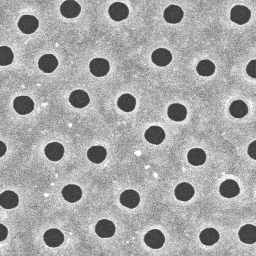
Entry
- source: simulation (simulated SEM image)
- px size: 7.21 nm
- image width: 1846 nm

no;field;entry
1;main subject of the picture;a regular array of holes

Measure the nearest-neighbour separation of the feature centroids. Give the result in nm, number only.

316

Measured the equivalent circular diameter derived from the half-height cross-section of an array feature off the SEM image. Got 0.146 microns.